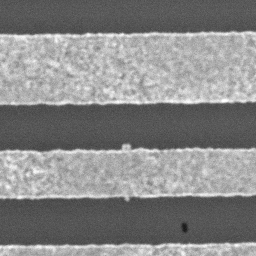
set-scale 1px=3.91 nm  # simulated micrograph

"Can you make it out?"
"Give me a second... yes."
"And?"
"lines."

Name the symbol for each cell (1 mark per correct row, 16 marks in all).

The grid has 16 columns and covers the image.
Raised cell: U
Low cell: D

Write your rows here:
DDDDDDDDDDDDDDDD
DDDDDDDDDDDDDDDD
UUUUUUUUUUUUUUUU
UUUUUUUUUUUUUUUU
UUUUUUUUUUUUUUUU
UUUUUUUUUUUUUUUU
DDDDDDDDDDDDDDDD
DDDDDDDDDDDDDDDD
DDDDDDDDDDDDDDDD
UUUUUUUUUUUUUUUU
UUUUUUUUUUUUUUUU
UUUUUUUUUUUUUUUU
DDDDDDDDDDDDDDDD
DDDDDDDDDDDDDDDD
DDDDDDDDDDDDDDDD
UUUUUUUUUUUUUUUU